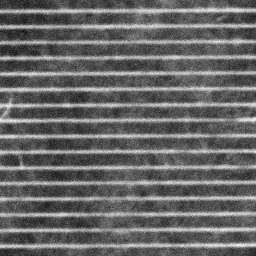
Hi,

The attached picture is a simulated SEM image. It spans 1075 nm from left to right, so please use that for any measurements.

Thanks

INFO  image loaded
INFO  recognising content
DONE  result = parallel lines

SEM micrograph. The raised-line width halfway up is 0.0095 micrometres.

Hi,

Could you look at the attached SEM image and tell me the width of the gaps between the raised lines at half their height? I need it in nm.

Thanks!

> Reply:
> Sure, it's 54.6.